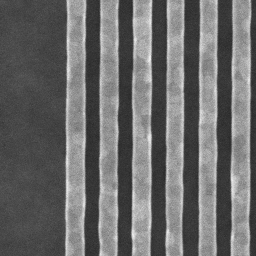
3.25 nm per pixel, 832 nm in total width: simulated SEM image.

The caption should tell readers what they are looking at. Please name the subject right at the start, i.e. wiring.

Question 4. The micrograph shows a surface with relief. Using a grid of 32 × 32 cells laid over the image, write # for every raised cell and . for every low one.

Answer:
........###..##..##..##..##..##.
........###..##..##..##..##..##.
........###..##..##..##..##..##.
........###..##..##..##..##..##.
........###..##..##..##..##..##.
........###..##..##..##..##..##.
........###..##..##..##..##..##.
........###..##..##..##..##..##.
........###..##..##..##..##..##.
........###..##..##..##..##..##.
........###..##..##..##..##..##.
........###..##..##..##..##..##.
........###..##..##..##..##..##.
........###..##..##..##..##..##.
........###..##..##..##..##..##.
........###..##..##..##..##..##.
........###..##..##..##..##..##.
........###..##..##..##..##..##.
........###..##..##..##..##..##.
........###.###..##..##..##..##.
........###.###..##..##..##..##.
........###.###..##..##..##..##.
........###..##..##..##..##..##.
........###..##..##..##..##..##.
........###.###..##..##..##..##.
........###.###..##..##..##..##.
........###.###..##..##..##..##.
........###.###..##..##..##..##.
........##..###..##..##..##..##.
........##..###..##..##..##..##.
........###.###..##..##..##..##.
........###.###..##..##..##..##.